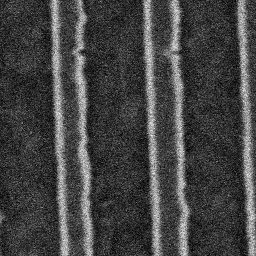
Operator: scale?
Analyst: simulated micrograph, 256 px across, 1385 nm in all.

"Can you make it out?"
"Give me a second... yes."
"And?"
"one or a few lines or trenches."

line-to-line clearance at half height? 362 nanometers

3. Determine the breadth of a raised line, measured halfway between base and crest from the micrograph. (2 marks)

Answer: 145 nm